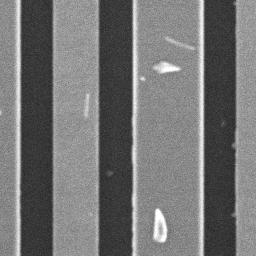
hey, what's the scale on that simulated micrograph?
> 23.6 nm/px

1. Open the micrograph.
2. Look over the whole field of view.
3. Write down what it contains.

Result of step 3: lines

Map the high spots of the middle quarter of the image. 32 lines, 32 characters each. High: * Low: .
*********........***************
*********........***************
*********........***************
*********........***************
*********........***************
*********........***************
*********........***************
*********........***************
*********........***************
*********........***************
*********........***************
*********........***************
*********........***************
*********........***************
*********........***************
*********........***************
*********........***************
*********........***************
*********........***************
*********........***************
*********........***************
*********........***************
*********........***************
*********........***************
*********........***************
*********........***************
*********........***************
*********........***************
*********........***************
*********........***************
*********........***************
*********........***************